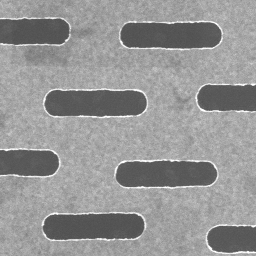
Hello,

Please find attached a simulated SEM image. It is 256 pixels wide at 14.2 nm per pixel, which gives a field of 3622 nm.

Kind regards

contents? holes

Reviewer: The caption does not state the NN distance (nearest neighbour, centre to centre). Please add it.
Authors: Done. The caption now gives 1340 nanometres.